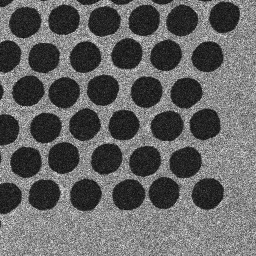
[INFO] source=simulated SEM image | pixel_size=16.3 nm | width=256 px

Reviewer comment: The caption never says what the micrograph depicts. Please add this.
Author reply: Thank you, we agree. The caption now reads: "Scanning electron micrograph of a regular array of holes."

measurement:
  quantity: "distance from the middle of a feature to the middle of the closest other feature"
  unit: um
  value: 0.611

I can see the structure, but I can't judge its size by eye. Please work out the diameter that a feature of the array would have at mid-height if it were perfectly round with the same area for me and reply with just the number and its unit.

519 nm